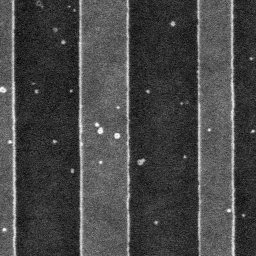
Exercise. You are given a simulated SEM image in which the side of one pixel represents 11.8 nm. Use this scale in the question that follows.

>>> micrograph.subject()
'lines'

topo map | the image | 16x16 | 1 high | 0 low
1000011100001100
1000011100001100
1000011100001100
1000011100001110
1000011100001110
1000011100001110
1000011100001110
1000011100001110
1000011100001110
1000011100001110
1000011100001110
1000011100001110
1000011100001110
1000011100001110
1000011100001110
1000011100001110